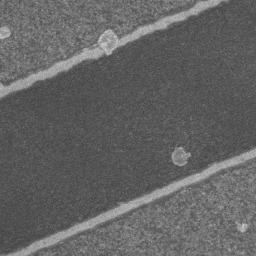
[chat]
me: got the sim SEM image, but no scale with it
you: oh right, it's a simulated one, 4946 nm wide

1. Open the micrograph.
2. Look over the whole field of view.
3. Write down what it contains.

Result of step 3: one or a few lines or trenches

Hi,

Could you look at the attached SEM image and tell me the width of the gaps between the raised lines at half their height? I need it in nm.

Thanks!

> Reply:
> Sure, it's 2980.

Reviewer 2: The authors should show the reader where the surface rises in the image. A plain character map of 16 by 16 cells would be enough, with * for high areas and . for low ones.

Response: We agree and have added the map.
************....
**********......
********........
*****...........
***.............
*...............
................
................
................
................
.............***
...........*****
.........*******
.......*********
....************
..**************